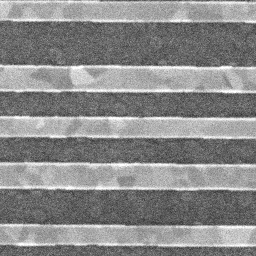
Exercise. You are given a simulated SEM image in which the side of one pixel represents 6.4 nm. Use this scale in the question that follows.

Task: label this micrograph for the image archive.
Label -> lines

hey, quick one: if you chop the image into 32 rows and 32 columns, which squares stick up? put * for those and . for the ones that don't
********************************
********************************
..******************************
................................
................................
................................
................................
................................
********************************
********************************
********************************
..............................**
................................
................................
................................
********************************
********************************
................................
................................
................................
***********.....................
********************************
********************************
........************************
................................
................................
................................
................................
********************************
********************************
..****......********************
................................